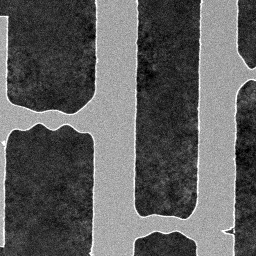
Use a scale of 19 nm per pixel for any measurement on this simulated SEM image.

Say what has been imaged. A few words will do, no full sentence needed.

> one or a few lines or trenches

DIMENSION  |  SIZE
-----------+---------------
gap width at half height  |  0.762 um